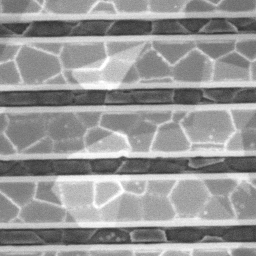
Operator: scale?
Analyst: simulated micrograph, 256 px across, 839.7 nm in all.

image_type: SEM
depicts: one or a few lines or trenches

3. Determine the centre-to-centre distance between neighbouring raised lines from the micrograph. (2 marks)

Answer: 227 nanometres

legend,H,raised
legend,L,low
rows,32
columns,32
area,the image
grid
HHHHHHHHHHHHHHHHHHHHHHHHHHHHHHHH
HHHHHHHHHHHHHHHHHHHHHHHHHHHHHHHH
LLLLLLLLLLLLLLLLLLLLLLLLLLLLLLLL
LLLLLLLLLLLLLLLLLLLLLLLLLLLLLLLL
LLLLLLLLLLLLLLLLLLLLLLLLLLLLLLLL
HHHHHHHHHHHHHHHHHHHHHHHHHHHHHHHH
HHHHHHHHHHHHHHHHHHHHHHHHHHHHHHHH
HHHHHHHHHHHHHHHHHHHHHHHHHHHHHHHH
HHHHHHHHHHHHHHHHHHHHHHHHHHHHHHHH
HHHHHHHHHHHHHHHHHHHHHHHHHHHHHHHH
HHHHHHHHHHHHHHHHHHHHHHHHHHHHLHHH
LLLLLLLLLLLLLLLLLLLLLLLLLLLLLLLL
LLLLLLLLLLLLLLLLLLLLLLLLLLLLLLLL
LLLLLLLLLLLLLLLLHHHHLLLLHHHHHHHH
HHHHHHHHHHHHHHHHHHHHHHHHHHHHHHHH
HHHHHHHHHHHHHHHHHHHHHHHHHHHHHHHH
HHHHHHHHHHHHHHHHHHHHHHHHHHHHHHHH
HHHHHHHHHHHHHHHHHHHHHHHHHHHHHHHH
HHHHHHHHHHHHHHHHHHHHHHHHHHHHHHHH
HHHHHLLLLLLLLLLLLLLLLLLLLLLLLLLL
LLLLLLLLLLLLLLLLLLLLLLLLLLLLLLLL
LLLLLLLLLLLLLLLLLLLLLLLLLLLLLLLL
HHHHHHHHHHHHHHHHHHHHHHHHHHHHHHHH
HHHHHHHHHHHHHHHHHHHHHHHHHHHHHHHH
HHHHHHHHHHHHHHHHHHHHHHHHHHHHHHHH
HHHHHHHHHHHHHHHHHHHHHHHHHHHHHHHH
HHHHHHHHHHHHHHHHHHHHHHHHHHHHHHHH
HHHHHHHHHHHHHHHHHHHHHHHHHHHHHHHH
LLLLLLLLLLLLLLLLLLLLLLLLLLLLLLLL
LLLLLLLLLLLLLLLLLLLLLLLLLLLLLLLL
LLLLLLLLLLLLLLLLLLLLLLLLLLLLLLLL
HHHHHHHHHHHHHHHHHHHHHHHHHHHHHHHH